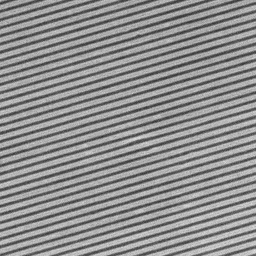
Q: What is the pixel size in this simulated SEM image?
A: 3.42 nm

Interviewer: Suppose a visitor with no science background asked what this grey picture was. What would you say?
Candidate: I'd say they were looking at parallel lines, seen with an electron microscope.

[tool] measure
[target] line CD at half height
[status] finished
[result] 14.8 nm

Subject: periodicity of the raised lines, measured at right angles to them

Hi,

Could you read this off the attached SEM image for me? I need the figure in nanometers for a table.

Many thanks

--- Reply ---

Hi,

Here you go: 26.7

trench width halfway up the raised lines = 0.0119 µm